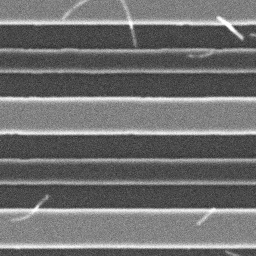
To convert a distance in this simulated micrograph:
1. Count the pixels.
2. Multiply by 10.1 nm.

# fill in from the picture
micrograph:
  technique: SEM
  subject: lines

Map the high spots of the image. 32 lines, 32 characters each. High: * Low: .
********************************
********************************
********************************
................................
................................
................................
********************************
********************************
********************************
................................
................................
................................
********************************
********************************
********************************
********************************
********************************
................................
................................
................................
********************************
********************************
********************************
................................
................................
................................
********************************
********************************
********************************
********************************
********************************
................................